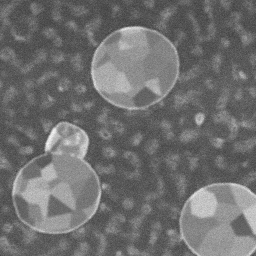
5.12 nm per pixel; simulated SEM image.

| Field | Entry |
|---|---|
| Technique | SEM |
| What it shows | raised bodies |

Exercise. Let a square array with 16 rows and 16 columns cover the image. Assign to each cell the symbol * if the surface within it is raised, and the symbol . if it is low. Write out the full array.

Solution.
................
................
.......***......
......*****.....
......*****.....
......*****.....
.......***......
................
...**...........
...**...........
.*****..........
.*****.......**.
.*****......****
.*****.....*****
...*.......*****
............****